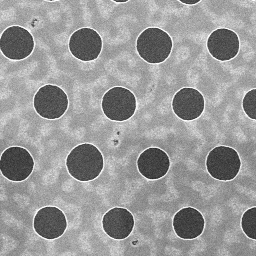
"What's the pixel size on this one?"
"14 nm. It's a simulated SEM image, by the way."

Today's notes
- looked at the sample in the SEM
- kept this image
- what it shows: a regular array of holes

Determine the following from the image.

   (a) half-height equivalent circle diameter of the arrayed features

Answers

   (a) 468 nm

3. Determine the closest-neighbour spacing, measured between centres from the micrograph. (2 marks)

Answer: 68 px